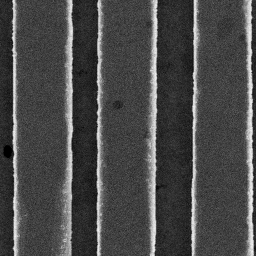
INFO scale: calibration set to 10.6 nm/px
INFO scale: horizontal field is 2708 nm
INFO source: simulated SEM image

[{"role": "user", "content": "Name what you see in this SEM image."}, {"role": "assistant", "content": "lines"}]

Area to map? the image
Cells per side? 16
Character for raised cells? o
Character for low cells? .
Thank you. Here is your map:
.ooo..oooo..oooo
.ooo..oooo..oooo
.ooo..oooo..oooo
.ooo..oooo..oooo
.ooo..oooo..oooo
.ooo..oooo..oooo
.ooo..oooo..oooo
.ooo..oooo..oooo
.ooo..oooo..oooo
.ooo..oooo..oooo
.ooo..oooo..oooo
.ooo..oooo..oooo
.ooo..oooo..oooo
.ooo..oooo..oooo
.ooo..oooo..oooo
.ooo..oooo..oooo